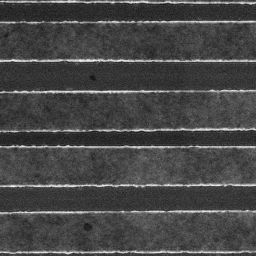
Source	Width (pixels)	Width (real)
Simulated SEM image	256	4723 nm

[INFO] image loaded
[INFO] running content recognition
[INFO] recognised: lines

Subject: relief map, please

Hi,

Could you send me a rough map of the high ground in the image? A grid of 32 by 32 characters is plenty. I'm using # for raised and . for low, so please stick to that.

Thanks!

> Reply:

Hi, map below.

................................
................................
................................
################################
################################
################################
################################
################################
................................
................................
................................
..#.############################
################################
################################
################################
################################
................................
................................
################################
################################
################################
################################
################################
................................
................................
................................
................#.##############
################################
################################
################################
################################
################.###.###########